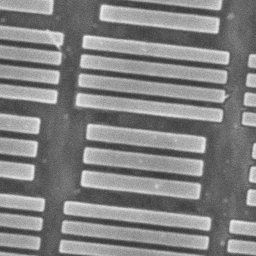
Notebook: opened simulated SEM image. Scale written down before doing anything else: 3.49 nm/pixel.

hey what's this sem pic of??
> groups of lines, slits or small figures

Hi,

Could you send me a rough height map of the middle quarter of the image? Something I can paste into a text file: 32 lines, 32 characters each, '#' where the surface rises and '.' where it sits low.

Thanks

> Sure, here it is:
.....########################...
...........#####################
...................#############
....#########................###
....#################...........
....########################....
............####################
.....................###########
...##########..................#
...###################..........
....###########################.
..............##################
......................##########
...............................#
................................
......###.......................
......###########...............
......#####################.....
......##########################
...........#####################
.....................###########
.....#####...................###
.....#############..............
.....#######################....
.....###########################
..............##################
......................##########
.....######...................##
.....################...........
.....########################...
.....###########################
...............#################